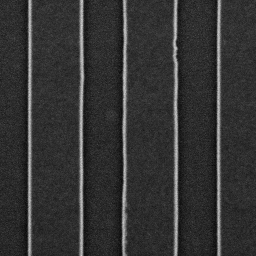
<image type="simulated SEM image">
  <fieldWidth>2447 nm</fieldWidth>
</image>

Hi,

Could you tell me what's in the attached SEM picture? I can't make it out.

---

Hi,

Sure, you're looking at one or a few lines or trenches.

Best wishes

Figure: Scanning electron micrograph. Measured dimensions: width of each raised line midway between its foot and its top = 498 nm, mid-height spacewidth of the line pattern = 405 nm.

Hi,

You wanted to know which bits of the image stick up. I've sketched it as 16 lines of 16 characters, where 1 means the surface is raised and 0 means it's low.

0011100011100011
0011100011100011
0011100011100011
0011100011100011
0011100011100011
0011100011100011
0011100011100011
0011100011100011
0011100011100011
0011100011100011
0011100011100011
0011100011100011
0011100011100011
0011100011100011
0011100011100011
0011100011100011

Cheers